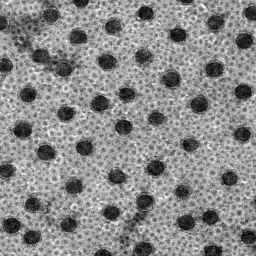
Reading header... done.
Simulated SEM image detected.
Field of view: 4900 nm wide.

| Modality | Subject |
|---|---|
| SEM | a regular array of raised bodies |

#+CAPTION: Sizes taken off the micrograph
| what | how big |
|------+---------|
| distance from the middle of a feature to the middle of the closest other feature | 0.463 microns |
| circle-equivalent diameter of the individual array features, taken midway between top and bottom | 16.9 px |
